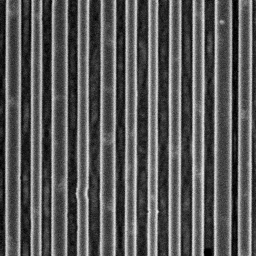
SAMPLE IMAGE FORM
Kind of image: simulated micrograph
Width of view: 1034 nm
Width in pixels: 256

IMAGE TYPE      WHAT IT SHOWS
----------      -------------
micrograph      parallel lines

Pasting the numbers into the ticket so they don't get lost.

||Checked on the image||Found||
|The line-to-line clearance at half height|11.1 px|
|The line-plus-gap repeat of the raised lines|93.5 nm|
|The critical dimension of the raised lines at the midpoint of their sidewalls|45.4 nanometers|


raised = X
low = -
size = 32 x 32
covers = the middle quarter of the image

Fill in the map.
X---XX---XXXX---XX---XX---XXX---
X---XX---XXXX---XX---XX---XXX---
X---XX---XXXX---XX---XX---XXX---
X---XX---XXXX---XX---XX---XXX---
X---XX---XXXX---XX---XX---XXX---
X---XX---XXXX---XX---XX---XXX---
X---XX---XXXX---XX---XX---XXX---
X---XX---XXXX---XX---XX---XXX---
X---XX---XXXX---XX---XX---XXX---
X---XX---XXXX---XX---XX---XXX---
X---XX---XXXX---XX---XX---XXX---
X---XX---XXXX---XX---XX---XXX---
X---XX---XXXX---XX---XX---XXX---
X---XX---XXXX---XX---XX---XXX---
X---XX---XXXX---XX---XX---XXX---
X---XX---XXXX---XX---XX---XXX---
X---XX---XXXX---XX---XX---XXX---
X---XX---XXXX---XX---XX---XXX---
X---XX---XXXX---XX---XX---XXX---
X---XX---XXXX---XX---XX---XXX---
X---XX---XXXX---XX---XX---XXX---
X---XX---XXXX---XX---XX---XXX---
X---XX---XXXX---XX---XX---XXX---
X---XX---XXXX---XX---XX---XXX---
X---XX---XXXX---XX---XX---XXX---
X---XX---XXXX---XX---XX---XXX---
X---XX---XXXX---XX---XX---XXX---
X---XX---XXXX---XX---XX---XXX---
X---XX---XXXX---XX---XX---XXX---
X---XX---XXXX---XX---XX---XXX---
X---XX---XXXX---XX---XX---XXX---
X--XXX---XXXX---XX---XX---XXX---